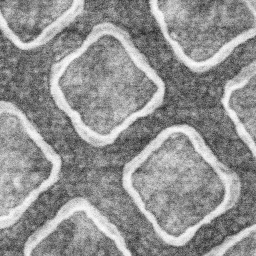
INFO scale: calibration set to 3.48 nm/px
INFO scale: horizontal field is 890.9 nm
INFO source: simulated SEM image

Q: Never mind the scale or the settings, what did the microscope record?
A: raised bodies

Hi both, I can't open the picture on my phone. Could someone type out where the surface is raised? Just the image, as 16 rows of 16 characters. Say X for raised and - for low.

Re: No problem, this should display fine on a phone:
XXXXX-----XXXXXX
XXXX------XXXXXX
-XX---XX--XXXXX-
----XXXXX--XXX--
----XXXXX-------
---XXXXXXX----XX
----XXXXXX----XX
X----XXX-------X
XX----X---XX---X
XXX------XXXX---
XXXX----XXXXXX--
XXX-----XXXXXX--
XX-------XXXXX--
X---XX---XXXX---
---XXXX---XX---X
--XXXXXX------XX